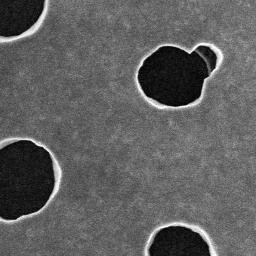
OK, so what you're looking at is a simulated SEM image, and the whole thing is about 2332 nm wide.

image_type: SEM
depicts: holes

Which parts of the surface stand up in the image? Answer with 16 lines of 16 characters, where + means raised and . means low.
...+++++++++++++
..++++++++++++++
++++++++++++++++
+++++++++....+++
+++++++++....+++
+++++++++....+++
++++++++++..++++
++++++++++++++++
++++++++++++++++
...+++++++++++++
...+++++++++++++
...+++++++++++++
...+++++++++++++
.+++++++++++++++
++++++++++..++++
+++++++++....+++